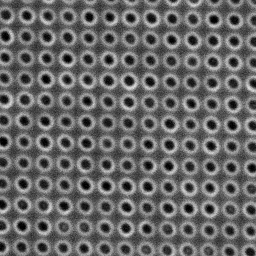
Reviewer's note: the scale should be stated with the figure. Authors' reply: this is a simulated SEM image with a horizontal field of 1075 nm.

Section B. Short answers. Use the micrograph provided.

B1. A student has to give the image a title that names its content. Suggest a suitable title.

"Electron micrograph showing a regular array of holes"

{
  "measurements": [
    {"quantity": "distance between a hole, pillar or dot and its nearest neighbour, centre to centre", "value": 86.9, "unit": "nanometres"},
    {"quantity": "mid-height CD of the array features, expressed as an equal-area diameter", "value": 48.4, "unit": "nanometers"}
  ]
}